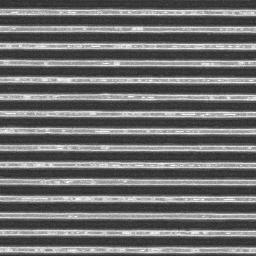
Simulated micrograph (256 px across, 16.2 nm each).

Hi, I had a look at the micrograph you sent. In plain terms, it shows parallel lines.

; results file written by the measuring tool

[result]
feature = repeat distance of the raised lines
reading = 275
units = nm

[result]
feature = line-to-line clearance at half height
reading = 0.162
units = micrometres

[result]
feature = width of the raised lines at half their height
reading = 7.25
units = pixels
